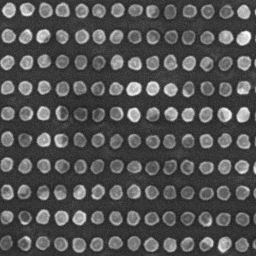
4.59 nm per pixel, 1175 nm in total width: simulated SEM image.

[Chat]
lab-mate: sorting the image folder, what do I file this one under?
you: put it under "a regular array of raised bodies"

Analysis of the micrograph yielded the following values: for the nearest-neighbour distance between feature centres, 81.3 nm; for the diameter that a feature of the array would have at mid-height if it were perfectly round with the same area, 58.9 nanometers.